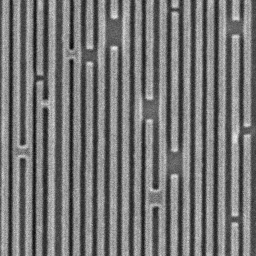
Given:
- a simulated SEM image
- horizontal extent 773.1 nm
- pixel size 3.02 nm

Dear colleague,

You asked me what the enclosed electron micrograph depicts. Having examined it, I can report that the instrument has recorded parallel lines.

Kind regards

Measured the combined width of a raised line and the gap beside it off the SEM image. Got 0.0365 microns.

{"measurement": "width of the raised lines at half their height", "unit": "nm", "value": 15.9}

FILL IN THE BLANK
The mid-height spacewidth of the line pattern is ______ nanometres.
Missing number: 20.8